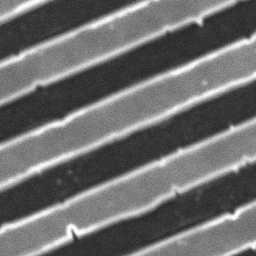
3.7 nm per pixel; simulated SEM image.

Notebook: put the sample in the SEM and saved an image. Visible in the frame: one or a few lines or trenches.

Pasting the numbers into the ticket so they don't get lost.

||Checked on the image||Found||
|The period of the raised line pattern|284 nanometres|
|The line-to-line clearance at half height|141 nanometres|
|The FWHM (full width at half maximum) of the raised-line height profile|0.142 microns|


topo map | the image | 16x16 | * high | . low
**......******..
......******....
...******......*
.******......***
*****......*****
**......******..
......******....
....******......
.******.......**
*****......*****
***......******.
*......*****....
....******......
..******......**
******......****
***......*******